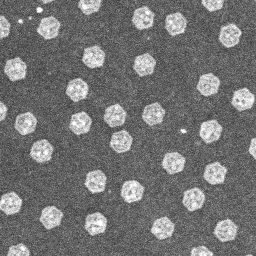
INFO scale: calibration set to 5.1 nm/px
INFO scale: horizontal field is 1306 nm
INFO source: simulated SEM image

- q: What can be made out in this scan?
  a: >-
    a regular array of raised bodies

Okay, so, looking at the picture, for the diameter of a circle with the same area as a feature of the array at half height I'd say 107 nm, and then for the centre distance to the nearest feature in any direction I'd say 192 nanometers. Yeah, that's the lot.